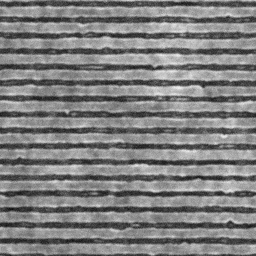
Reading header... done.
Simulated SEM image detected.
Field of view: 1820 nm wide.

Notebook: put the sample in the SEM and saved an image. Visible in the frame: parallel lines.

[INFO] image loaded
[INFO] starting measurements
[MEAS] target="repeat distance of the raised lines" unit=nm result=112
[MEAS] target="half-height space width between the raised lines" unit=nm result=50.7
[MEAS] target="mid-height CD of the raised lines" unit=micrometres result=0.064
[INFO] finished